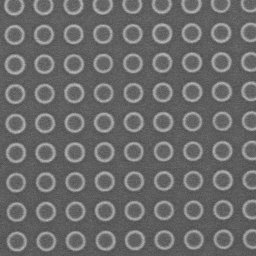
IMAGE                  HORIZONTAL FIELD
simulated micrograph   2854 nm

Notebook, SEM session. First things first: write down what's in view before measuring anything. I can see an array of small figures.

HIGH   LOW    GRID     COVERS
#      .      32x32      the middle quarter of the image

#####...####...#####..#####...##
.###....###.....###....###....##
................................
................................
................................
.###....####....###....###....##
#####...####...#####..#####...##
#####...####...#####..#####...##
.####...####...####....####...##
..#..............#..............
................................
................................
..#......##.....###....###.....#
.####...####...#####...####...##
#####...####...#####..#####...##
#####...####...#####...####...##
.###....###.....###....###.....#
................................
................................
................................
.####...####....###....####...##
#####...####...#####...####...##
#####...####...#####...####...##
.####...####....###....####....#
..#.............................
................................
................................
.###.....###....###....####....#
.####...####...#####...####...##
.####...####...#####...####...##
.####...####...####....####...##
.###.....##......#..............